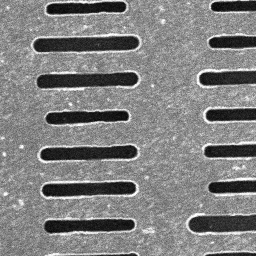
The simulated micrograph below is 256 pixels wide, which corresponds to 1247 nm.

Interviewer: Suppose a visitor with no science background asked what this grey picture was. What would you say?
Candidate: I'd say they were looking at holes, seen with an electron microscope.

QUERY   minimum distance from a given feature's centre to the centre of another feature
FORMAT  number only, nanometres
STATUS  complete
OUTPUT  176